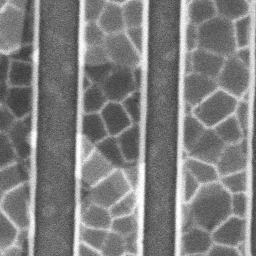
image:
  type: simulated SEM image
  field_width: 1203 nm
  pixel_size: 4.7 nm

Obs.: one or a few lines or trenches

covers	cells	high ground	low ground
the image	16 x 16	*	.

**...****..*****
**...****..*****
**...****..*****
**...****..*****
**...****..*****
**...****..*****
**...****..*****
**...****..*****
**...****..*****
**...****..*****
**...****..*****
**...****..*****
**...****..*****
**...****..*****
**...****..****.
**...****..****.